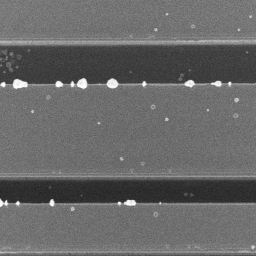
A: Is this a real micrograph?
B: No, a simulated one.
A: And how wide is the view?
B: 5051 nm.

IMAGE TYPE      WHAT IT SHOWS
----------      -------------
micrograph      lines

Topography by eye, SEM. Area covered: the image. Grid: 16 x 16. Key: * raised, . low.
****************
****************
****************
................
................
****************
****************
****************
****************
****************
****************
................
................
****************
****************
****************